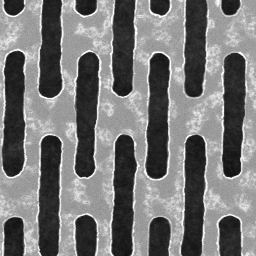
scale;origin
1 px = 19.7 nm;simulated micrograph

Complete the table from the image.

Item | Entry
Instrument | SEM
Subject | holes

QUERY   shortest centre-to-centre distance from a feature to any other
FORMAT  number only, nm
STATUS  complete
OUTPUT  1420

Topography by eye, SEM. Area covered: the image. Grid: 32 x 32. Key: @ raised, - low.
---@@---@@--@@---@@--@@---@@--@@
@--@@---@@--@@---@@--@@---@@-@@@
@@@@@---@@@@@@---@@@@@@---@@@@@@
@@@@@---@@@@@@---@@@@@@---@@@@@@
@@@@@---@@@@@@---@@@@@@---@@@@@@
@@@@@---@@@@@@---@@@@@@---@@@@@@
@--@@---@@@@@@---@@@@@@---@@@@@@
@--@@---@@--@@---@@--@@---@@---@
@--@@---@@--@@---@@--@@---@@---@
@--@@---@@--@@---@@--@@---@@---@
@--@@---@@--@@---@@--@@--@@@---@
@--@@---@@--@@--@@@--@@--@@@---@
@--@@@@@@---@@@@@@@--@@@@@@@---@
@--@@@@@@---@@@@@@---@@@@@@@---@
---@@@@@@@--@@@@@@---@@@@@@@---@
---@@@@@@@--@@@@@@---@@@@@@@--@@
---@@@@@@@--@@@@@@---@@@@@@@--@@
---@@--@@@--@@@--@---@@--@@@--@@
---@@---@@--@@---@---@@---@@--@@
---@@---@---@@---@---@@---@@--@@
---@@---@---@@---@---@@---@@--@@
@--@@--@@---@@---@---@@---@@--@@
@@@@@--@@@@@@@---@@@@@@---@@@@@@
@@@@@--@@@@@@@---@@@@@@---@@@@@@
@@@@@--@@@@@@@---@@@@@@--@@@@@@@
@@@@@--@@@@@@@---@@@@@@--@@@@@@@
@@@@@--@@@@@@@---@@@@@@---@@@@@@
@--@@---@@--@@---@@--@@--@@@--@@
---@@--@@---@@---@@--@@--@@---@@
---@@--@@---@@---@@--@@--@@---@@
---@@--@@---@@---@@--@@--@@---@@
@--@@--@@@--@@---@@--@@--@@---@@